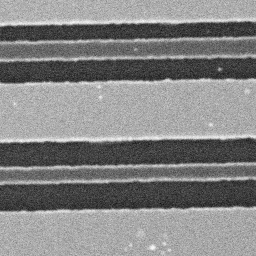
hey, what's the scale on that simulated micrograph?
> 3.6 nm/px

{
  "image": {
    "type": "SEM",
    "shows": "lines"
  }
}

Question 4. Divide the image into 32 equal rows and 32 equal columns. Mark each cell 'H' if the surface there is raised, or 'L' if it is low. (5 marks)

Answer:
HHHHHHHHHHHHHHHHHHHHHHHHHHHHHHHH
HHHHHHHHHHHHHHHHHHHHHHHHHHHHHHHH
HHHHHHHHHHHHHHHHHHHHHHHHHHHHHHHH
LLLLLLLLLLLLLLLLLLLLLLLLLLLLLLLL
LLLLLLLLLLLLLLLLLLLLLLLLLLLLLLLL
HHHHHHHHHHHHHHHHHHHHHHHHHHHHHHHH
HHHHHHHHHHHHHHHHHHHHHHHHHHHHHHHH
HHHHHHLLHLLLLLLLLLLLLLLLLLLLLLLL
LLLLLLLLLLLLLLLLLLLLLLLLLLLLLLLL
LLLLLLLLLLLLLLLLLLLLLLLLLLLLLLLL
HLLHHHHHHHHHHHHHHHHHHHHHHHHHHHHH
HHHHHHHHHHHHHHHHHHHHHHHHHHHHHHHH
HHHHHHHHHHHHHHHHHHHHHHHHHHHHHHHH
HHHHHHHHHHHHHHHHHHHHHHHHHHHHHHHH
HHHHHHHHHHHHHHHHHHHHHHHHHHHHHHHH
HHHHHHHHHHHHHHHHHHHHHHHHHHHHHHHH
HHHHHHHHHHHHHHHHHHHHHHHHHHHHHHHH
HHHHHHHHHHHHHHLHLLLLLLLLLLLLLLLL
LLLLLLLLLLLLLLLLLLLLLLLLLLLLLLLL
LLLLLLLLLLLLLLLLLLLLLLLLLLLLLLLL
LLLLLLLLLLLLLLLLLLLLLLLLLLLLLHHH
HHHHHHHHHHHHHHHHHHHHHHHHHHHHHHHH
HHHHHHHHHHHHHHHHHHHLLLLLLHLLLLLL
LLLLLLLLLLLLLLLLLLLLLLLLLLLLLLLL
LLLLLLLLLLLLLLLLLLLLLLLLLLLLLLLL
LLLLLLLLLLLLLLLLLLLLLLLLLLLLLLLL
LLHHHHHHHHHHHHHHHHHHHHHHHHHHHHHH
HHHHHHHHHHHHHHHHHHHHHHHHHHHHHHHH
HHHHHHHHHHHHHHHHHHHHHHHHHHHHHHHH
HHHHHHHHHHHHHHHHHHHHHHHHHHHHHHHH
HHHHHHHHHHHHHHHHHHHHHHHHHHHHHHHH
HHHHHHHHHHHHHHHHHHHHHHHHHHHHHHHH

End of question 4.